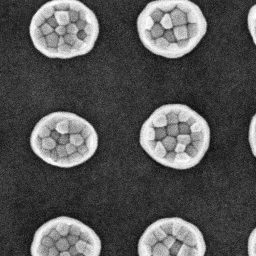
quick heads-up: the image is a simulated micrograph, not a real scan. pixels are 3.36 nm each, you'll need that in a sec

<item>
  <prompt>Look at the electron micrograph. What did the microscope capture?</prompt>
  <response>raised bodies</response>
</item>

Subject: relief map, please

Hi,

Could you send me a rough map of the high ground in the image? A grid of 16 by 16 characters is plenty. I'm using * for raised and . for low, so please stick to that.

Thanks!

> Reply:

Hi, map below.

...**....***....
..****...****...
..****...***....
...**...........
................
................
................
...**....****...
..****...****...
..****...****...
................
................
................
................
..****...***....
..****...****...